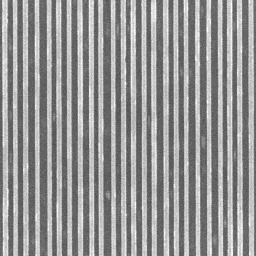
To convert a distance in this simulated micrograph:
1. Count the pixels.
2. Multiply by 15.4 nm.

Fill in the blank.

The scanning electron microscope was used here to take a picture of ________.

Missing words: parallel lines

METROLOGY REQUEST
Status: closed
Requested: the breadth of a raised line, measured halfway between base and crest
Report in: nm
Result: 69.4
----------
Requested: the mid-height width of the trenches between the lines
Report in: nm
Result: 94.5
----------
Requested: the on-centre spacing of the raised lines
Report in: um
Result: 0.165